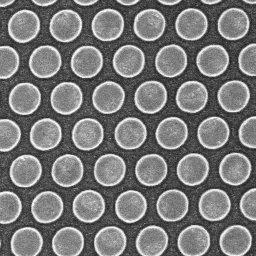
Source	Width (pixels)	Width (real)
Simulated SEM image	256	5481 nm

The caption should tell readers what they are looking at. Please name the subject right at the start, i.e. a regular array of raised bodies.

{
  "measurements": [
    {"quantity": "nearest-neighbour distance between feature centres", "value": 886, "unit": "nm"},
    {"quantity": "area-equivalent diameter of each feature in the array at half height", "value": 0.665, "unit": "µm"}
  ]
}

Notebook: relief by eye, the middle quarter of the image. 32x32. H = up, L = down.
LLHHHHHHHLLLLHHHHHHHLLLHHHHHHHLL
LLHHHHHHHLLLLHHHHHHLLLLLHHHHHHLL
LLLHHHHHLLLLLLHHHHLLLLLLHHHHLLLL
LLLLLLLLLLLLLLLLLLLLLLLLLLLLLLLL
LLLLLLLLLLLLLLLLLLLLLHHLLLLLLLLL
HHHLLLLLLHHHHHLLLLLHHHHHHLLLLHHH
HHHHLLLLHHHHHHHLLLHHHHHHHLLLLHHH
HHHHLLLHHHHHHHHLLLHHHHHHHHLLHHHH
HHHHLLLHHHHHHHHLLLHHHHHHHHLLHHHH
HHHHLLLHHHHHHHHLLLHHHHHHHLLLHHHH
HHHHLLLLHHHHHHLLLLHHHHHHHLLLLHHH
HHHLLLLLLHHHHLLLLLLHHHHHLLLLLLHH
LLLLLLLLLLLLLLLLLLLLLLLLLLLLLLLL
LLLLLLLLLLLLLLLLLLLLLLLLLLLLLLLL
LLLLHHHHLLLLLLHHHHHLLLLLHHHHHHLL
LLLHHHHHHLLLLHHHHHHHLLLLHHHHHHHL
LLHHHHHHHHLLLHHHHHHHLLLHHHHHHHHL
LLHHHHHHHHLLLHHHHHHHLLLHHHHHHHHL
LLHHHHHHHHLLLHHHHHHHLLLHHHHHHHLL
LLLHHHHHHLLLLHHHHHHHLLLLHHHHHHLL
LLLHHHHHLLLLLLHHHHHLLLLLLHHHHLLL
LLLLLLLLLLLLLLLLLLLLLLLLLLLLLLLL
LLLLLLLLLLLLLLLLLLLLLLLLLLLLLLLL
HHHLLLLLLHHHHHLLLLLLHHHHLLLLLLHH
HHHHLLLLHHHHHHHLLLLHHHHHHLLLLHHH
HHHHLLLLHHHHHHHLLLHHHHHHHHLLLHHH
HHHHHLLLHHHHHHHLLLHHHHHHHHLLHHHH
HHHHLLLLHHHHHHHLLLHHHHHHHHLLLHHH
HHHHLLLLHHHHHHHLLLLHHHHHHLLLLHHH
HHHLLLLLLHHHHHLLLLLHHHHHLLLLLLHH
HLLLLLLLLLLLLLLLLLLLLLLLLLLLLLLL
LLLLLLLLLLLLLLLLLLLLLLLLLLLLLLLL